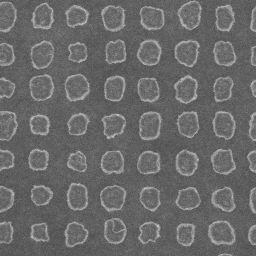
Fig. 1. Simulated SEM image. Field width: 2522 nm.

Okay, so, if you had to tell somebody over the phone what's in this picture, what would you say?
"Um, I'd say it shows a regular array of raised bodies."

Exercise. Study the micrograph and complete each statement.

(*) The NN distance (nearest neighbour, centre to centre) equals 343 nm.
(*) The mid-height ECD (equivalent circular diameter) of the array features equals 228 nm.